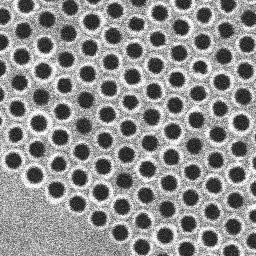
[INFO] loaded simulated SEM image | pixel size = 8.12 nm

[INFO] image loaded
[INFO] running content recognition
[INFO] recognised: a regular array of holes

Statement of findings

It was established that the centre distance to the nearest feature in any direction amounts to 208 nm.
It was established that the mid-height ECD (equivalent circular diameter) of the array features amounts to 135 nm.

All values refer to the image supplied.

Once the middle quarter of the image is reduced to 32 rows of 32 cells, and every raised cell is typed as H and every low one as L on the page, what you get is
LLHHHLLHHHLLLLHHHHHHHLLLLHHHHHHH
HHHHLLLLHHHLLHHHLLHHHLLLLHHHHHHH
HHHHLLLLHHHHHHHLLLLHHHHHHHHLLLHH
LHHHLLLLHHHHHHHLLLLHHHHHHHLLLLHH
LLHHHLLHHHLLHHHHLLLHHHHHHHLLLLHH
LLHHHHHHHLLLLHHHHHHHHLLLHHHLLLHH
LLHHHHHHHLLLLHHHHHHHLLLLHHHHHHHH
HHHHLLLHHHLLLHHHHHHHHLLLHHHHHHHL
HHHLLLLHHHHHHHHLLLHHHLLLHHHLLHHH
HHHLLLLHHHHHHHLLLLLHHHHHHHLLLLHH
LHHHLLLHHHHHHHHLLLLHHHHHHHLLLLHH
LLHHHHHHHLLLLHHHLHHHHLLHHHLLLLHH
LLHHHHHHHLLLLHHHHHHHLLLLHHHHHHHH
LHHHLHHHHLLLLHHHHHHHLLLLHHHHHHHL
HHHLLLLHHHLLHHHLLHHHLLLLHHHHHHHL
HHHLLLLHHHHHHHLLLLHHHHHHHHLLLHHH
HHHLLLLHHHHHHHLLLLHHHHHHHLLLLHHH
LHHHLLHHHLLHHHHLLLHHHHHHHLLLLHHH
LHHHHHHHLLLLHHHHHHHHLLLHHHLLLHHH
LHHHHHHHLLLLHHHHHHHLLLLHHHHHHHHL
HHHLLLHHHLLLHHHLHHHLLLLHHHHHHHLL
HHLLLLHHHHHHHHLLLHHHLLLHHHLLHHHL
HHLLLLLHHHHHHLLLLLHHHHHHHLLLLHHH
HHHLLLHHHLHHHHLLLLHHHHHHHLLLLHHH
LHHHHHHHLLLHHHLLLHHHLLHHHLLLLHHH
LHHHHHHHLLLLHHHHHHHLLLLHHHHHHHHL
HHHLHHHHLLLLHHHHHHHLLLLHHHHHHHLL
HHLLLLHHHLLHHHLLHHHLLLLHHHHHHHLL
HHLLLLHHHHHHHLLLLHHHHHHHHLLLHHHL
HHLLLLHHHHHHHLLLLHHHHHHHLLLLHHHH
HHHLLHHHLLHHHLLLLHHHHHHHLLLLHHHH
HHHHHHHLLLLHHHHHHHHLLLHHHLLLHHHL